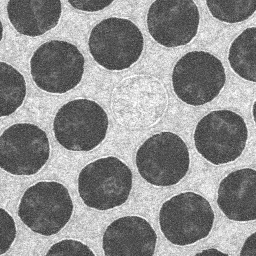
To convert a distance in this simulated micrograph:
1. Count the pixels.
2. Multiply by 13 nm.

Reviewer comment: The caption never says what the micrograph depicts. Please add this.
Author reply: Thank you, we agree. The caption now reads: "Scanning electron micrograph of a regular array of holes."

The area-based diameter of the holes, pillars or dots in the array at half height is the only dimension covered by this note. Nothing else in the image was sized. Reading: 712 nm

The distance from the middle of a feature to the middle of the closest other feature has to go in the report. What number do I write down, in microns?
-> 0.815